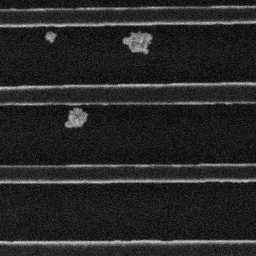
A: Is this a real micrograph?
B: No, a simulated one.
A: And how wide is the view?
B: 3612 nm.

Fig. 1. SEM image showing lines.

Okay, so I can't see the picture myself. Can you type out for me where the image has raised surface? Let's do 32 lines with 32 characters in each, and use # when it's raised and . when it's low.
................................
################################
################################
................................
................................
................................
................................
................................
................................
................................
......................##########
################################
################################
................................
................................
................................
................................
................................
................................
................................
................................
################################
################################
................................
................................
................................
................................
................................
................................
................................
################################
################################